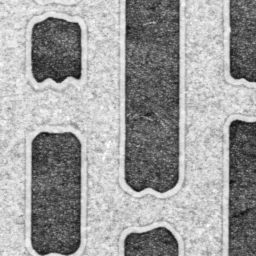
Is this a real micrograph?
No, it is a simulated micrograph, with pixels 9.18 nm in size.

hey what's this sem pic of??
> one or a few lines or trenches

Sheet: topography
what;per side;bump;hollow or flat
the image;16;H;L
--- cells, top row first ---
HHHHHHHHLLLHHHLL
HHLLLHHHLLLHHHLL
HHLLLHHHLLLHHHLL
HHLLLHHHLLLHHHLL
HHLLLHHHLLLHHHLL
HHHHHHHHLLLHHHHH
HHHHHHHHLLLHHHHH
HHHHHHHHLLLHHHHL
HHLLLHHHLLLHHHLL
HHLLLHHHLLLHHHLL
HHLLLHHHLLLHHHLL
HHLLLHHHLLLHHHLL
HHLLLHHHHHHHHHLL
HHLLLHHHHHHHHHLL
HHLLLHHHLLLHHHLL
HHLLLHHHLLLHHHLL